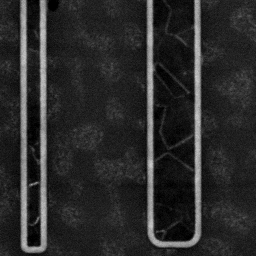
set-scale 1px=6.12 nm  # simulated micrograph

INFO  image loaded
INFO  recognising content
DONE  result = one or a few lines or trenches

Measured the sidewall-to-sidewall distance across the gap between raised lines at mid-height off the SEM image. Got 657 nm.